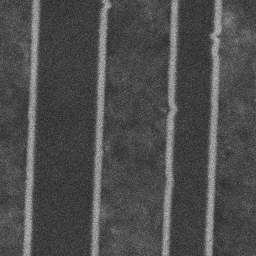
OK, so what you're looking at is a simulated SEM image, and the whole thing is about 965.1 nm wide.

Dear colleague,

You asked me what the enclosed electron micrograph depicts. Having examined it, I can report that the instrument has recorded one or a few lines or trenches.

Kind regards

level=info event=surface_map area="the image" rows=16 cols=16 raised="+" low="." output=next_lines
..+++++....+++..
..++++.....+++..
..++++.....+++..
..++++.....++...
..++++.....++...
..++++.....++...
..++++.....++...
..++++.....++...
..++++.....++...
..++++.....++...
..++++.....++...
..++++.....++...
..++++....+++...
..++++....+++...
..++++....+++...
..++++....+++...